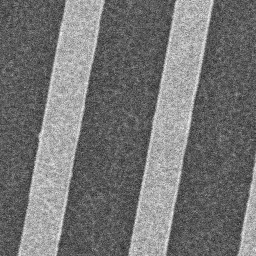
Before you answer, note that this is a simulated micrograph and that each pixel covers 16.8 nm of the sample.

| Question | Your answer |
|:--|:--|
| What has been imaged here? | one or a few lines or trenches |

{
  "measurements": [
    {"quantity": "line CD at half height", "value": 584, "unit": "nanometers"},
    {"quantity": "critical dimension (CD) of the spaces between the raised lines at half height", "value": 1.22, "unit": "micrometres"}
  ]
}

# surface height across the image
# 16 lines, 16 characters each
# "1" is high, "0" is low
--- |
0000110000011000
0000110000011000
0000110000011000
0001110000111000
0001110000110000
0001100000110000
0001100000110000
0001100000110000
0001100001110000
0011100001110000
0011000001100000
0011000001100000
0011000001100000
0011000001100001
0111000011100001
0111000011000001